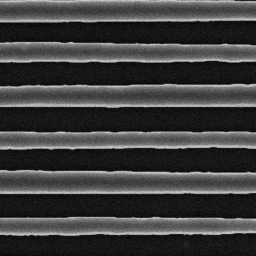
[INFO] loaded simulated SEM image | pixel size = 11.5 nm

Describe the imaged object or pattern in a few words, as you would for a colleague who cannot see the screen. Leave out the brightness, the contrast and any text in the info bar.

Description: lines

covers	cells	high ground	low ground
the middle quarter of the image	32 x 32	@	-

--------------------------------
--------------------------------
--------------------------------
--------------------------------
--------------------------------
---@@@----------@@@@@@@@@@@@@@@@
@@@@@@@@@@@@@@@@@@@@@@@@@@@@@@@@
@@@@@@@@@@@@@@@@@@@@@@@@@@@@@@@@
@@@@@@@@@@@@@@@@@@@@@@@@@@@@@@@@
@@@@@@@@@@@@@@@@@@@@@@@@@@@@@@@@
@@@@@@@@@@@@@@@@@@@@@@@@@@@@@@@@
--------------------------------
--------------------------------
--------------------------------
--------------------------------
--------------------------------
--------------------------------
@@@@@@@@@@@@@@@@@@@@@@@@@@@@@@@@
@@@@@@@@@@@@@@@@@@@@@@@@@@@@@@@@
@@@@@@@@@@@@@@@@@@@@@@@@@@@@@@@@
@@@@@@@@@@@@@@@@@@@@@@@@@@@@@@@@
--------------------------------
--------------------------------
--------------------------------
--------------------------------
--------------------------------
--------------------------------
@@@@@@@@@@@@@@@@@@@@@@@@@@@@@@@@
@@@@@@@@@@@@@@@@@@@@@@@@@@@@@@@@
@@@@@@@@@@@@@@@@@@@@@@@@@@@@@@@@
@@@@@@@@@@@@@@@@@@@@@@@@@@@@@@@@
@@@@@@@@@@@@@@@@@@@@@@@@@@@@@@@@